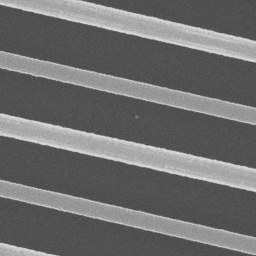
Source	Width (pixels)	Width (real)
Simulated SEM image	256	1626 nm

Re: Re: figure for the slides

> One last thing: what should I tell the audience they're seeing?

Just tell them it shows lines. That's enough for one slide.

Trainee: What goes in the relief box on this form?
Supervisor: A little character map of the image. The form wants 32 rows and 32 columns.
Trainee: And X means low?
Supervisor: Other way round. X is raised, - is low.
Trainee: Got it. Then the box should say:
XXXXXXXXXXXX--------------------
-----XXXXXXXXXXX----------------
---------XXXXXXXXXXX------------
-------------XXXXXXXXXXX--------
------------------XXXXXXXXXXX---
----------------------XXXXXXXXXX
--------------------------XXXXXX
XXXXX--------------------------X
XXXXXXXXX-----------------------
-----XXXXXXXXX------------------
----------XXXXXXXX--------------
--------------XXXXXXXXX---------
------------------XXXXXXXXX-----
-----------------------XXXXXXXX-
X--------------------------XXXXX
XXXXXX--------------------------
XXXXXXXXXX----------------------
---XXXXXXXXXXXX-----------------
--------XXXXXXXXXXX-------------
------------XXXXXXXXXXXX--------
-----------------XXXXXXXXXXXX---
---------------------XXXXXXXXXXX
--------------------------XXXXXX
XXXX--------------------------XX
XXXXXXXXX-----------------------
----XXXXXXXXX-------------------
---------XXXXXXXX---------------
-------------XXXXXXXXX----------
-----------------XXXXXXXXX------
----------------------XXXXXXXXX-
--------------------------XXXXXX
XXXXX--------------------------X